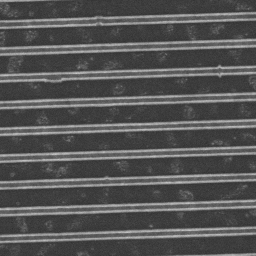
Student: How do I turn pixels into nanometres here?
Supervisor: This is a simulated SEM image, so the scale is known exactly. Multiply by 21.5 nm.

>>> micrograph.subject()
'parallel lines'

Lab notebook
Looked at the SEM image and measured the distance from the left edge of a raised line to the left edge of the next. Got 576 nm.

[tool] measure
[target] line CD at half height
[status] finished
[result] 137 nanometres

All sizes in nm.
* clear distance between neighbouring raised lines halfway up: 436